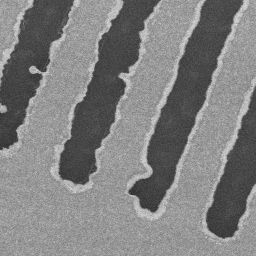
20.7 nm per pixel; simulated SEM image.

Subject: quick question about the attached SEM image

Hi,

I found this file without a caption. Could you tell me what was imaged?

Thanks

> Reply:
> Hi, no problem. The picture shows one or a few lines or trenches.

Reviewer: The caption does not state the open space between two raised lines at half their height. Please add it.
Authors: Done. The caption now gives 775 nanometers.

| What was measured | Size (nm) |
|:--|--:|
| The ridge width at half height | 856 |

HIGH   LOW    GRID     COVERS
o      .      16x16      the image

oo..ooo...oo...o
o...ooo..ooo...o
o...oo...ooo..oo
...ooo...oo...oo
...ooo..ooo..ooo
..ooo...ooo..ooo
..ooo..ooo...oo.
..oo...ooo..ooo.
.ooo...oo...ooo.
oooo..ooo...oo..
oooo..ooo..ooo..
oooo.ooo...ooo..
oooooooo..ooo...
ooooooooooooo..o
ooooooooooooo..o
oooooooooooooooo